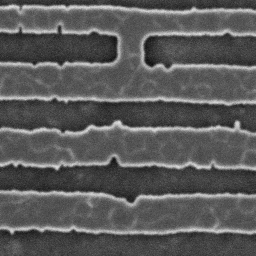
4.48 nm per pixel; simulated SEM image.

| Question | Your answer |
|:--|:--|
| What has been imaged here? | one or a few lines or trenches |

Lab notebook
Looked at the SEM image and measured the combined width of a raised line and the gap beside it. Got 286 nanometres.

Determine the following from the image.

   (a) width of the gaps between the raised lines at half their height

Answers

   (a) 29 px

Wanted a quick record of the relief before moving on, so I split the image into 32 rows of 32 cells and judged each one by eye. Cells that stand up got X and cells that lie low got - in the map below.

--------------------------------
XXXXXXXXXXXXXXXXXXXXXX-XXXXXXXXX
XXXXXXXXXXXXXXXXXXXXXXXXXXXXXXXX
XXXXXXXXXXXXXXXXXXXXXXXXXXXXXXXX
--------------XXXXX-------------
---------------XXX--------------
---------------XXX--------------
--------------XXXX--------------
XXXXXXXXXXXXXXXXXXXXXXXXXXXXXXXX
XXXXXXXXXXXXXXXXXXXXXXXXXXXXXXXX
XXXXXXXXXXXXXXXXXXXXXXXXXXXXXXXX
XXXXXXXXXXXXXXXXXXXXXXXXXXXXXXXX
--------X---XXXXXXXX-XXXXXXXXXXX
--------------------------------
--------------------------------
--------------X-----------------
XXXXXXXX--XXXXXXXXXXXXXXXXXXXXX-
XXXXXXXXXXXXXXXXXXXXXXXXXXXXXXXX
XXXXXXXXXXXXXXXXXXXXXXXXXXXXXXXX
XXXXXXXXXXXXXXXXXXXXXXXXXXXXXXXX
X-XXXXXXXXXXX--XXXXXXXXXXXXXXXXX
--------------------------------
--------------------------------
--------------------------------
XXXXXXXXXXXXXX------XXXXXXXXXXXX
XXXXXXXXXXXXXXXXXXXXXXXXXXXXXXXX
XXXXXXXXXXXXXXXXXXXXXXXXXXXXXXXX
XXXXXXXXXXXXXXXXXXXXXXXXXXXXXXXX
XXXXXXXXXXXXXXXXXXXXXXXXXXXXXXXX
--------------------------------
--------------------------------
--------------------------------